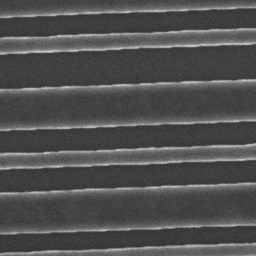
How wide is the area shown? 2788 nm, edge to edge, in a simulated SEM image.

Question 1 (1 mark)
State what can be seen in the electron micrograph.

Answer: lines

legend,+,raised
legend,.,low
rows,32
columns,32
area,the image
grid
++++++++++++++++++++++++++++++++
+++++++++++++++++...............
................................
................................
.......+++++++++++++++++++++++++
+++++++++++++++++++++++++++++++.
+++++++.........................
................................
................................
................................
.................+++++++++++++++
++++++++++++++++++++++++++++++++
++++++++++++++++++++++++++++++++
++++++++++++++++++++++++++++++++
++++++++++++++++++++++++++++++++
++++++++++++++++++++............
................................
................................
....................++++++++++++
++++++++++++++++++++++++++++++++
+++++++++++++++++++.............
................................
................................
...................+++++++++++++
++++++++++++++++++++++++++++++++
++++++++++++++++++++++++++++++++
++++++++++++++++++++++++++++++++
++++++++++++++++++++++++++++++++
++++++++++++++++++++............
................................
................................
......++++++++++++++++++++++++++